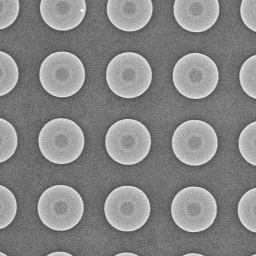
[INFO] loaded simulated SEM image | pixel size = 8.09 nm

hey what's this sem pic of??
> an array of small figures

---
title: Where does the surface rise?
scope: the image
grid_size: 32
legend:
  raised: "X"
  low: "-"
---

XX---XXXXXX--XXXXXX---XXXXX---XX
XX---XXXXXX--XXXXXX---XXXXX---XX
XX----XXXX----XXXXX---XXXXX---XX
X------XX------XXX-----XXX-----X
--------------------------------
--------------------------------
--------------------------------
XX----XXXX----XXXX----XXXX-----X
XX---XXXXX---XXXXXX---XXXXX---XX
XX---XXXXXX--XXXXXX---XXXXX---XX
XX---XXXXX----XXXXX---XXXXX---XX
X-----XXXX----XXXX----XXXX-----X
--------------------------------
--------------------------------
--------------------------------
X-----XXX-----XXXX-----XXX-----X
XX---XXXXX----XXXXX---XXXXX---XX
XX---XXXXX---XXXXXX---XXXXX---XX
XX---XXXXX---XXXXXX---XXXXX---XX
X-----XXXX----XXXX----XXXXX---XX
---------------XX------XX------X
--------------------------------
--------------------------------
X-----XXX------XX------XX-------
XX---XXXXX----XXXX----XXXX----XX
XX---XXXXX---XXXXXX--XXXXXX---XX
XX---XXXXX---XXXXXX--XXXXXX---XX
XX---XXXXX---XXXXX----XXXXX---XX
------XXX-----XXX------XXX-----X
--------------------------------
--------------------------------
--------------------------------